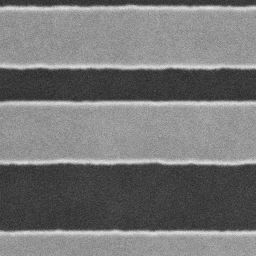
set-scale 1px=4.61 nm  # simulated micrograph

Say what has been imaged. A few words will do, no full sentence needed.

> lines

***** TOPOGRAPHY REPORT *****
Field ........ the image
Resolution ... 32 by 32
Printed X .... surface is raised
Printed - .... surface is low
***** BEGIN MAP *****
--------------------------------
XXXXXXXXXXXXXXXXXXXXXXXXXXXXXXXX
XXXXXXXXXXXXXXXXXXXXXXXXXXXXXXXX
XXXXXXXXXXXXXXXXXXXXXXXXXXXXXXXX
XXXXXXXXXXXXXXXXXXXXXXXXXXXXXXXX
XXXXXXXXXXXXXXXXXXXXXXXXXXXXXXXX
XXXXXXXXXXXXXXXXXXXXXXXXXXXXXXXX
XXXXXXXXXXXXXXXXXXXXXXXXXXXXXXXX
--XX--XX--X-X--XXXXXX--XXXXX--XX
--------------------------------
--------------------------------
--------------------------------
--------------------------------
XXXXXXXXXXXXXXXXXXXXXXXXXXXXXXXX
XXXXXXXXXXXXXXXXXXXXXXXXXXXXXXXX
XXXXXXXXXXXXXXXXXXXXXXXXXXXXXXXX
XXXXXXXXXXXXXXXXXXXXXXXXXXXXXXXX
XXXXXXXXXXXXXXXXXXXXXXXXXXXXXXXX
XXXXXXXXXXXXXXXXXXXXXXXXXXXXXXXX
XXXXXXXXXXXXXXXXXXXXXXXXXXXXXXXX
---------------------------XXX--
--------------------------------
--------------------------------
--------------------------------
--------------------------------
--------------------------------
--------------------------------
--------------------------------
--------------------------------
XXXXXXXXXXXXXXXXXXXXXXXXXXXXXXXX
XXXXXXXXXXXXXXXXXXXXXXXXXXXXXXXX
XXXXXXXXXXXXXXXXXXXXXXXXXXXXXXXX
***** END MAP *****